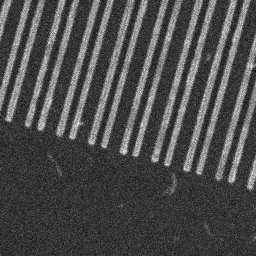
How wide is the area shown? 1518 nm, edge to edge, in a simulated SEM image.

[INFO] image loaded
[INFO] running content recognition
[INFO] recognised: parallel lines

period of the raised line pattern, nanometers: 96.6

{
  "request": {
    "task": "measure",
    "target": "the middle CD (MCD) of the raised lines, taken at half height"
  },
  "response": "32.1 nanometres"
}